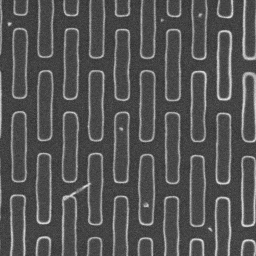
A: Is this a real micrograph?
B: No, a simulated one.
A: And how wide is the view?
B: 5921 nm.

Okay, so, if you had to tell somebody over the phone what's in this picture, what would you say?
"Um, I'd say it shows groups of lines, slits or small figures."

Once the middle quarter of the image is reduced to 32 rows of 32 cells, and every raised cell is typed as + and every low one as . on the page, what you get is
+++..........+++..........+++...
+++..........+++..........+++...
+++...++++...+++...++++...+++...
+++...++++...+++...++++...+++...
+++...++++...+++...++++...+++...
+++...++++...+++...++++...+++...
+++...++++...+++...++++...+++...
+++...++++...+++...++++...+++...
+++...++++...+++...++++...+++...
......++++.........++++.........
......++++.........++++.........
......++++.........++++.........
+++...++++...+++...++++...++....
+++...++++...+++...++++...+++...
+++...++++...+++...++++...+++...
+++...++++...+++...++++...+++...
+++...++++...+++...++++...+++...
+++...++++...+++...++++...+++...
+++...++++...+++...+++....+++...
+++..........+++..........+++...
+++..........+++..........+++...
+++..........+++..........+++...
+++....++....+++..........+++...
+++...++++...+++...+++....+++...
+++...++++...+++...+++....+++...
+++...++++...+++...+++....+++...
+++...++++...+++...+++....+++...
+++...++++...+++...+++....+++...
+++...++++...+++...+++....+++...
......++++...++....++++...++....
......++++.........++++.........
......+++..........++++.........